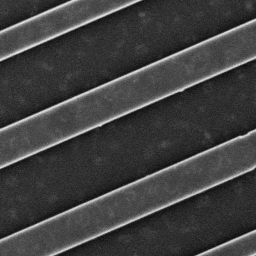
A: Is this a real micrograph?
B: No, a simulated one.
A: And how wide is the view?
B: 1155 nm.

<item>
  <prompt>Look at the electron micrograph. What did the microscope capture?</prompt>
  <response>one or a few lines or trenches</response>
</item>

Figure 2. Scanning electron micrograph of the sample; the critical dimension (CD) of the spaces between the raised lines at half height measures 0.294 microns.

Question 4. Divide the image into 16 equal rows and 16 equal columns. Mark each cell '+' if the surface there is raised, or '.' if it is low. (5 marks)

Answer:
...+++++........
.++++..........+
+++..........+++
+..........+++++
........++++++..
......++++++....
....+++++.......
.++++++.........
+++++..........+
++...........+++
..........++++++
........++++++..
......+++++.....
...++++++.......
.++++++.........
++++.........+++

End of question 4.